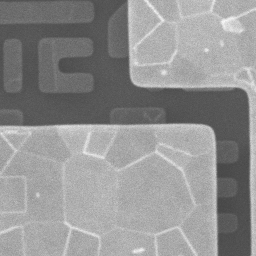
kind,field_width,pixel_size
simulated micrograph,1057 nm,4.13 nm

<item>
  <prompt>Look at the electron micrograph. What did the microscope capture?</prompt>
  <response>wiring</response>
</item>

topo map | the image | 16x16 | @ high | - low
--------@@@@@@@@
--------@@@@@@@@
--------@@@@@@@@
--------@@@@@@@@
--------@@@@@@@@
---------------@
----------------
----------------
@@@@@@@@@@@@@---
@@@@@@@@@@@@@---
@@@@@@@@@@@@@---
@@@@@@@@@@@@@@--
@@@@@@@@@@@@@@--
@@@@@@@@@@@@@@--
@@@@@@@@@@@@@@--
@@@@@@@@@@@@@@--